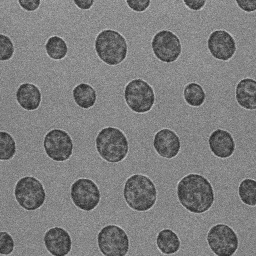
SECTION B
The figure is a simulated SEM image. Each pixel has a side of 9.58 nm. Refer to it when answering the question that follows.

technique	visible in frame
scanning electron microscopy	a regular array of holes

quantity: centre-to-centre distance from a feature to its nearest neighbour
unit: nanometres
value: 527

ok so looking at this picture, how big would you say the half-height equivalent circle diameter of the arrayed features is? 284 nm